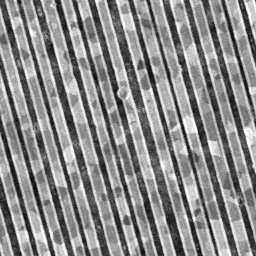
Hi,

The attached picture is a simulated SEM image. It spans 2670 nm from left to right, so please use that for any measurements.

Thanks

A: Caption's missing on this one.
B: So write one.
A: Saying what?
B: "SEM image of parallel lines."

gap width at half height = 80.4 nm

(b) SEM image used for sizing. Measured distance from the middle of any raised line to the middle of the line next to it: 184 nm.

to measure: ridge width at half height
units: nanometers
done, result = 98.1